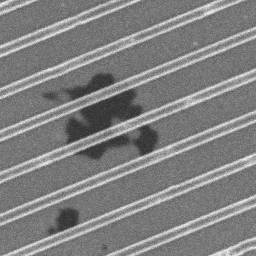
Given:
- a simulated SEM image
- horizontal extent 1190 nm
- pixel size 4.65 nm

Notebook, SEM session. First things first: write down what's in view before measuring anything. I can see parallel lines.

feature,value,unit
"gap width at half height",137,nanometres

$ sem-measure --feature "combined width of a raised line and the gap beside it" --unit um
0.182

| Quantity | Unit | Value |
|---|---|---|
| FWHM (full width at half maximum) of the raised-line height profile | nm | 44.2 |